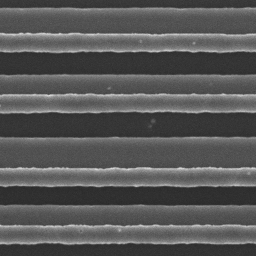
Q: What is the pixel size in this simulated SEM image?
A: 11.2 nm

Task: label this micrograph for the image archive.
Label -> lines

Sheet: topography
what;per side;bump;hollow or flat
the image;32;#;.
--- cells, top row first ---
................................
################################
################################
################################
################################
################################
.......#........................
................................
................................
################################
################################
################################
################################
################################
................................
................................
................................
################################
################################
################################
################################
################################
################################
................................
................................
................................
################################
################################
################################
################################
................................
................................